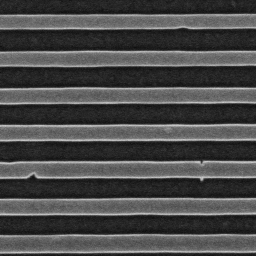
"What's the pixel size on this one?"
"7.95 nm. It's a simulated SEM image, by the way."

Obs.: parallel lines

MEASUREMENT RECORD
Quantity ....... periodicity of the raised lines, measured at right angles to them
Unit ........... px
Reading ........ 37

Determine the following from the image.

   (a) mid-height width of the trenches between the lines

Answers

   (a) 0.169 um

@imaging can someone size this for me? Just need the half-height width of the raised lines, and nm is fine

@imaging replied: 123